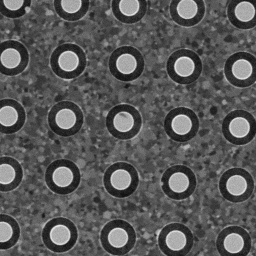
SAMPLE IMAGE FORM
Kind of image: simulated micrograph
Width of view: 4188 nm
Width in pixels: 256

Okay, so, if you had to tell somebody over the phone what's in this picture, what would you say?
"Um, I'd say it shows an array of small figures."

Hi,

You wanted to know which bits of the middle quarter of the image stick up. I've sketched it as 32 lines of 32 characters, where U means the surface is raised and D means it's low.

UUUDDDUUUUUDDUUUUUDDUUUUUDDDUUUU
UUDDDUUUUUUDDDUUUUDDUUUUUUDDUUUU
DDDDUUUUUUUUDDDDDDDUUUUUUUDDDUUU
DDDUUUUUUUUUUDDDDDUUUUUUUUDDDDDD
UUUUUUUUUUUUUUUDUUUUUUUUUUUUDDDD
UUUUUUUUUUUUUUUUUUUUUUUUUUUUUUUU
UUUUUUUUUUUUUUUUUUUUUUUUUUUUUUUU
UUUUUUUUUUUUUUUUUUUUUUUUUUUUUUUU
UUUUUUUUUUUUUUUUUUUUUUUUUUUUUUUU
DDUUUUUUUUUUUUUUUUUUUUUUUUUUUUUU
DDDDUUUUUUUUUDDDDUUUUUUUUUUUUUUU
UDDDUUUUUUUDDDDDDDDUUUUUUUUDDDDD
UUUDDUUUUUUDDUUUDDDUUUUUUUDDDDDD
UUUDDUUUUUDDDUUUUDDUUUUUUDDDUUUD
UUUDDUUUUUDDUUUUUDDDUUUUUDDUUUUU
UUDDDUUUUUUDDUUUUDDDUUUUUDDUUUUU
DDDDUUUUUUUDDDUUDDDUUUUUUDDUUUUD
DDDUUUUUUUUUDDDDDDDUUUUUUUDDDDDD
UUUUUUUUUUUUUDDDDUUUUUUUUUDDDDDD
UUUUUUUUUUUUUUUUUUUUUUUUUUUUDDUU
UUUUUUUUUUUUUUUUUUUUUUUUUUUUUUUU
UUUUUUUUUUUUUUUUUUUUUUUUUUUUUUUU
UUUUUUUUUUUUUUUUUUUUUUUUUUUUUUUU
UUUUUUUUUUUUUUUUUUUUUUUUUUUUUUUU
DDUUUUUUUUUUUDDUUUUUUUUUUUUUUUUU
DDDUUUUUUUUDDDDDDUUUUUUUUUUDDDDU
UDDDUUUUUUDDDDUDDDUUUUUUUDDDDDDD
UUDDUUUUUUDDUUUUDDDUUUUUUDDDUUDD
UUDDUUUUUUDDUUUUUDDUUUUUDDDUUUUD
UUDDUUUUUUDDUUUUUDDUUUUUDDUUUUUD
DDDDUUUUUUDDUUUUDDDUUUUUDDUUUUUD
DDDUUUUUUUDDDDDDDDUUUUUUUDDUUUDD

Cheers